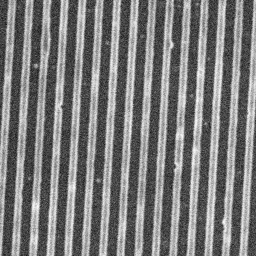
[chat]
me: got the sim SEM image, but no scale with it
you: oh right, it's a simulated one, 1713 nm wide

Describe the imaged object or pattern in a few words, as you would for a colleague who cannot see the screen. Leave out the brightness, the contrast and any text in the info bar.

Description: parallel lines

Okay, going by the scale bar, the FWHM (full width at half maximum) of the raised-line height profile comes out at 40.9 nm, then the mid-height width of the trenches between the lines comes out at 73.4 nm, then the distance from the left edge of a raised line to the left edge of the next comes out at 117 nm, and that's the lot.